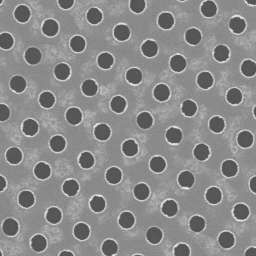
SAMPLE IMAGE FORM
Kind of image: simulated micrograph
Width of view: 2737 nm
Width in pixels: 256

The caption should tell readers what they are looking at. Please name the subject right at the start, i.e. a regular array of holes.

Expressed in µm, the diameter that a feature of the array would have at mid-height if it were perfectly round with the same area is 0.175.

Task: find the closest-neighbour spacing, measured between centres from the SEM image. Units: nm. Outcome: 337